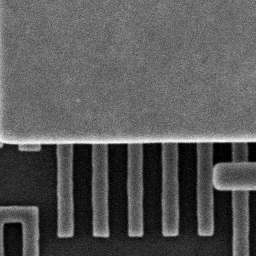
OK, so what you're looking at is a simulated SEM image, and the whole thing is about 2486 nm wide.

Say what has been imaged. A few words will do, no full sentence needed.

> wiring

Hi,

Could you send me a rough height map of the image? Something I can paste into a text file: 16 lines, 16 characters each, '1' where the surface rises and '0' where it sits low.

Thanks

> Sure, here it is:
1111111111111111
1111111111111111
1111111111111111
1111111111111111
1111111111111111
1111111111111111
1111111111111111
1111111111111111
1111111111111111
0000000000000000
0000000000000000
0000000000000000
0000000000000000
0000000000000000
0000000000000000
0000000000000000